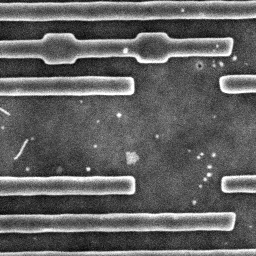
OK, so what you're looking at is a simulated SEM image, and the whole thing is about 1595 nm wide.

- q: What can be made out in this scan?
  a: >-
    wiring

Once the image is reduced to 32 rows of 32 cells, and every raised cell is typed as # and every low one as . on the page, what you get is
################################
################################
...###..........................
................................
......###........####...........
#############################...
#############################...
.....#####.......####...........
................................
............................####
#################...........####
#################...........####
................................
................................
................................
................................
................................
................................
................................
................................
................................
................................
#################...........####
#################...........####
................................
................................
................................
#############################...
#############################...
................................
................................
...............#################